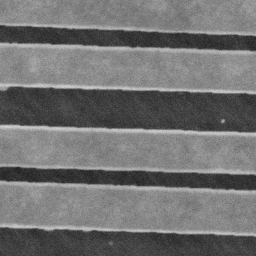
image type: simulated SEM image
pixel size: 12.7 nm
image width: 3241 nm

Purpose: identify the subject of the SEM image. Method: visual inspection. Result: lines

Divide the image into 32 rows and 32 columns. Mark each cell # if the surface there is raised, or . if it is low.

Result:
################################
################################
################################
............####################
................................
................................
################################
################################
################################
################################
################################
..............................##
................................
................................
................................
................................
#####################...........
################################
################################
################################
################################
.............................###
................................
#####################...........
################################
################################
################################
################################
.........#######################
................................
................................
................................